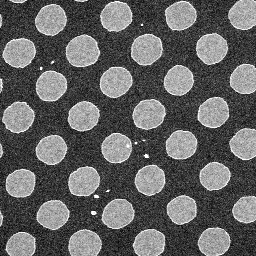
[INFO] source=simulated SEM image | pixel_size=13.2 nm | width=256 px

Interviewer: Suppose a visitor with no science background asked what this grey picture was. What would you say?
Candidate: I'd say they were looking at a regular array of raised bodies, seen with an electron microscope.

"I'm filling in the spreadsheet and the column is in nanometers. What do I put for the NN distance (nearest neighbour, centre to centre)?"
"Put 596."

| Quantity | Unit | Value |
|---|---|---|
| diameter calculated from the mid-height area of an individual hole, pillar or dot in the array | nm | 400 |